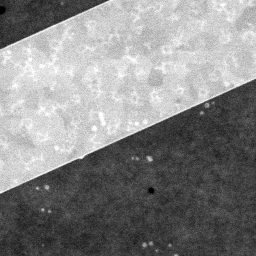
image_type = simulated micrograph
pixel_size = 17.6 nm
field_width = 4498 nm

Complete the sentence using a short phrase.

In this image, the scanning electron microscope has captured one or a few lines or trenches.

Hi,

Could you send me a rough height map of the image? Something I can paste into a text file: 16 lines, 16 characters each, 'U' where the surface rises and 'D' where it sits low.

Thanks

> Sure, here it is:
DDDDDDUUUUUUUUUU
DDDDUUUUUUUUUUUU
DUUUUUUUUUUUUUUU
UUUUUUUUUUUUUUUU
UUUUUUUUUUUUUUUU
UUUUUUUUUUUUUUUD
UUUUUUUUUUUUDDDD
UUUUUUUUUUDDDDDD
UUUUUUUUDDDDDDDD
UUUUUUDDDDDDDDDD
UUUUDDDDDDDDDDDD
UDDDDDDDDDDDDDDD
DDDDDDDDDDDDDDDD
DDDDDDDDDDDDDDDD
DDDDDDDDDDDDDDDD
DDDDDDDDDDDDDDDD